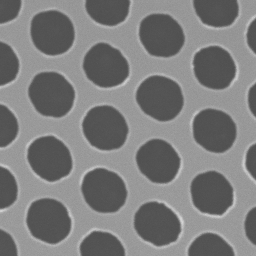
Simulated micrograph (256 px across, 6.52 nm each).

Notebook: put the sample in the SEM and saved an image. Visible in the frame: a regular array of holes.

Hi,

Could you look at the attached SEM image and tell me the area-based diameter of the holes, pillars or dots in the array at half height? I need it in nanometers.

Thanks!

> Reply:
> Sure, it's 295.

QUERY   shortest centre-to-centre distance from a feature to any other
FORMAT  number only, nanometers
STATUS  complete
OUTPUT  404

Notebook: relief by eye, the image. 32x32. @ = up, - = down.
---@@@@@@@@-----@@@@@@@@------@@
--@@@--@@@@-----@@@@@@@@------@@
--@@-----@@@----@@----@@@----@@@
@@@@-----@@@@@@@@------@@@@@@@@-
@@@@-----@@@@@@@@------@@@@@@@@-
-@@@-----@@@--@@@@-----@@@@@@@@-
--@@@---@@@----@@@----@@@---@@@@
--@@@@@@@@------@@@@@@@@-----@@@
--@@@@@@@@------@@@@@@@@-----@@@
--@@----@@@-----@@@-@@@@-----@@@
-@@@-----@@@---@@@----@@@----@@@
@@@@-----@@@@@@@@------@@@@@@@@-
@@@@-----@@@@@@@@------@@@@@@@@-
-@@@-----@@@--@@@@-----@@@@@@@@-
--@@@@--@@@----@@@@---@@-----@@@
--@@@@@@@@------@@@@@@@@-----@@@
--@@@@@@@@------@@@@@@@@------@@
--@@---@@@@-----@@@-@@@@-----@@@
@@@@----@@@@---@@-----@@@----@@-
@@@------@@@@@@@@-----@@@@@@@@@-
@@@@-----@@@@@@@@------@@@@@@@@-
-@@@-----@@---@@@@----@@@@-@@@@-
--@@@@-@@@-----@@@@---@@----@@@@
--@@@@@@@@------@@@@@@@@-----@@@
--@@@@@@@@------@@@@@@@@-----@@@
-@@@----@@@----@@@--@@@@-----@@@
@@@-----@@@@--@@@-----@@@---@@@-
@@@------@@@@@@@@-----@@@@@@@@@-
@@@------@@@@@@@@------@@@@@@@@-
-@@@----@@@---@@@-----@@@--@@@@-
--@@@@-@@@-----@@@@--@@@-----@@@
--@@@@@@@@------@@@@@@@@-----@@@